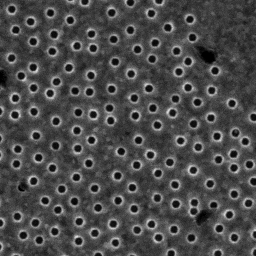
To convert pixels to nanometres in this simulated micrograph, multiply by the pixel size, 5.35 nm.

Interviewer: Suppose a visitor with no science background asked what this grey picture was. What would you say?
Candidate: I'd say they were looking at a regular array of holes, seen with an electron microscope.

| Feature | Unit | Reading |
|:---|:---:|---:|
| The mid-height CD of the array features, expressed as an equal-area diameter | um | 0.0418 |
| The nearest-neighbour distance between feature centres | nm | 93.7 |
